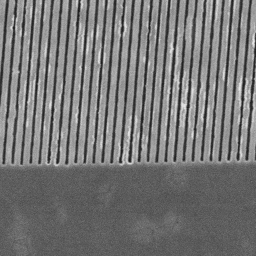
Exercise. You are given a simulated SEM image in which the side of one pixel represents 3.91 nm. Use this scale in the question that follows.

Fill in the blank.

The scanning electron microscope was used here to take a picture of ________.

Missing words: parallel lines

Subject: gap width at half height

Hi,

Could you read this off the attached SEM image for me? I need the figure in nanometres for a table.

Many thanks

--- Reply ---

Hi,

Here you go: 11.7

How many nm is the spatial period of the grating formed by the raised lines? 35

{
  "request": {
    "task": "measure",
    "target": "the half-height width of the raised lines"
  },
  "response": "22.9 nm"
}